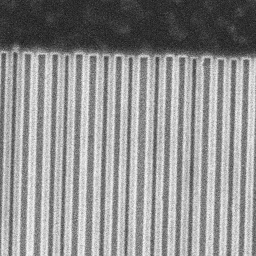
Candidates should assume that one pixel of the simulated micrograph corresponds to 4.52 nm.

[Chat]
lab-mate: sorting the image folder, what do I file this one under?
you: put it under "parallel lines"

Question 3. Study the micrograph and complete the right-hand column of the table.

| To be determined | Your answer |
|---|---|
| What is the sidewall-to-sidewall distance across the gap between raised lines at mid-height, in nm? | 30.5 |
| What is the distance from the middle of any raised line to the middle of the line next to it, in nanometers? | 57.9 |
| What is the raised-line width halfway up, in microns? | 0.0305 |